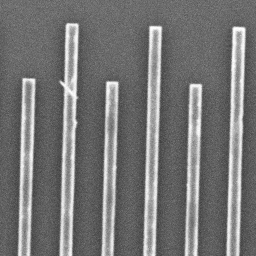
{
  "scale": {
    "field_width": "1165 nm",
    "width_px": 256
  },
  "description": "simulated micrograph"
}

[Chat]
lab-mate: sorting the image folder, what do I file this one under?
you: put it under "parallel lines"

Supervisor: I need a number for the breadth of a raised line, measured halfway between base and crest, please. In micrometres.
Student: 0.0495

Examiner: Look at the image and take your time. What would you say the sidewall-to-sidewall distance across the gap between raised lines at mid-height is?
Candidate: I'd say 0.142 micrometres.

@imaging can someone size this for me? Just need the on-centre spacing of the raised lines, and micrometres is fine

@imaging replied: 0.19